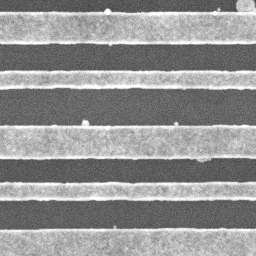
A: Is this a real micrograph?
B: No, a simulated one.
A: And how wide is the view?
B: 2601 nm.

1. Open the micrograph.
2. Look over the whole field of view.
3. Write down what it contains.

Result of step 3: lines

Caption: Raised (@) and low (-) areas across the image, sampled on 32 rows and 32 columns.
--------------------------------
-------------@------------@@----
@@@@@@@@@@@@@@@@@@@@@@@@@@@@@@@@
@@@@@@@@@@@@@@@@@@@@@@@@@@@@@@@@
@@@@@@@@@@@@@@@@@@@@@@@@@@@@@@@@
--------------------------------
--------------------------------
--------------------------------
--------------------------------
@@@@@@@@@@@@@@@@@@@@@@@@@@@@@@@@
@@@@@@@@@@@@@@@@@@@@@@@@@@@@@@@@
--------------------------------
--------------------------------
--------------------------------
--------------------------------
--------------------------------
@@@@@@@@@@@@@@@@@@@@@@@@@@@@@@@@
@@@@@@@@@@@@@@@@@@@@@@@@@@@@@@@@
@@@@@@@@@@@@@@@@@@@@@@@@@@@@@@@@
@@@@@@@@@@@@@@@@@@@@@@@@@@@@@@@@
--------------------------------
--------------------------------
--------------------------------
@@@@@@@@@@@@@@@@@@@@@@@@@@@@@@@@
@@@@@@@@@@@@@@@@@@@@@@@@@@@@@@@@
--------------------------------
--------------------------------
--------------------------------
--------------------------------
@@@@@@@@@@@@@@@@@@@@@@@@@@@@@@@@
@@@@@@@@@@@@@@@@@@@@@@@@@@@@@@@@
@@@@@@@@@@@@@@@@@@@@@@@@@@@@@@@@